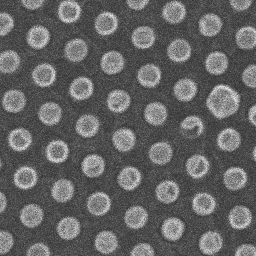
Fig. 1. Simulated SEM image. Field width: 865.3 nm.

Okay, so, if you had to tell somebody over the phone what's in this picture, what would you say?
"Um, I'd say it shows a regular array of raised bodies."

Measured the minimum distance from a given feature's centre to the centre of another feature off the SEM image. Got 38.3 pixels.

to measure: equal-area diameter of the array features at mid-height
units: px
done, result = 23